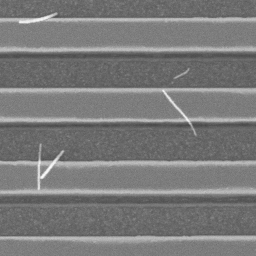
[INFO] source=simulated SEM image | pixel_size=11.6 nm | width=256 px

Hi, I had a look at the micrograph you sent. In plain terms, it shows lines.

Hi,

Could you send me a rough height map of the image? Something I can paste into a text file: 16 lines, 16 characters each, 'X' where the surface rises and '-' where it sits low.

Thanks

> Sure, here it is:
----------------
XXXXXXXXXXXXXXXX
XXXXXXXXXXXXXXXX
----------------
----------------
----------------
XXXXXXXXXXXXXXXX
XXXXXXXXXXXXXXXX
----------------
----------------
XXXXXXXXXXXXXXXX
XXXXXXXXXXXXXXXX
----------------
----------------
----------------
XXXXXXXXXXXXXXXX